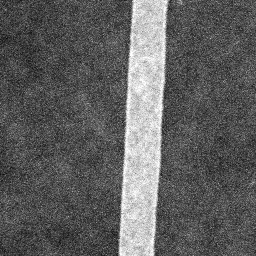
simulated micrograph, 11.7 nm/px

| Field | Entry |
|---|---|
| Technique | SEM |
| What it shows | one or a few lines or trenches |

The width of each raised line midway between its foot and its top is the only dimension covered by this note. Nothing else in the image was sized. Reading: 0.398 um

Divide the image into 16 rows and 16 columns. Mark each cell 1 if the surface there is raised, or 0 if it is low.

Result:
0000000011000000
0000000011000000
0000000011000000
0000000011000000
0000000011000000
0000000011000000
0000000011000000
0000000011000000
0000000011000000
0000000011000000
0000000011000000
0000000011000000
0000000011000000
0000000011000000
0000000011000000
0000000111000000